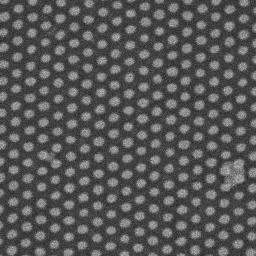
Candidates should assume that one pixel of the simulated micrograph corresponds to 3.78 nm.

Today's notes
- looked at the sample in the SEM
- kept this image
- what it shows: a regular array of raised bodies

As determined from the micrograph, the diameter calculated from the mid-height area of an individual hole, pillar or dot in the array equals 8.89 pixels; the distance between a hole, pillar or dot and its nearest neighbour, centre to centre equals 0.0594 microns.